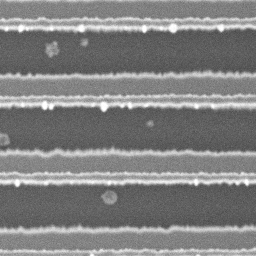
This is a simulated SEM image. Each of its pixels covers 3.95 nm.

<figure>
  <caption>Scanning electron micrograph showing lines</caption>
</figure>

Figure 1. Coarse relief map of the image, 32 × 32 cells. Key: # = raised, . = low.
################################
################################
################################
###########.###########..###....
................................
................................
................................
................................
................................
.#.......#....#####..#.#########
################################
################################
################################
................................
................................
................................
................................
................................
................................
################################
################################
################################
################################
................................
................................
................................
................................
................................
.....................##.......##
################################
################################
################################